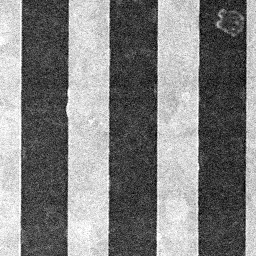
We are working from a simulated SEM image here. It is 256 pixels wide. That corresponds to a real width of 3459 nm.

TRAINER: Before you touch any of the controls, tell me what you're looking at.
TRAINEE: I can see one or a few lines or trenches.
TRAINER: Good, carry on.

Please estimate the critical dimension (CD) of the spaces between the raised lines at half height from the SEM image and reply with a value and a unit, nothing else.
0.652 microns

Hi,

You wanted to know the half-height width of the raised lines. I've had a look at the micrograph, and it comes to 0.542 microns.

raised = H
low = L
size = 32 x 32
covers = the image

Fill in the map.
HHHLLLLLLHHHHHLLLLLLHHHHHLLLLLLH
HHHLLLLLLHHHHHLLLLLLHHHHHLLLLLLH
HHHLLLLLLHHHHHLLLLLLHHHHHLLLHHLH
HHHLLLLLLHHHHHLLLLLLHHHHHLLLHHLH
HHHLLLLLLHHHHHLLLLLLHHHHHLLLLLLH
HHHLLLLLLHHHHHLLLLLLHHHHHLLLLLLH
HHHLLLLLLHHHHHLLLLLLHHHHHLLLLLLH
HHHLLLLLLHHHHHLLLLLLHHHHHLLLLLLH
HHHLLLLLLHHHHHLLLLLLHHHHHLLLLLLH
HHHLLLLLLHHHHHLLLLLLHHHHHLLLLLLH
HHHLLLLLLHHHHHLLLLLLHHHHHLLLLLLH
HHLLLLLLLHHHHHLLLLLLHHHHHLLLLLLH
HHLLLLLLLHHHHHLLLLLLHHHHHLLLLLLH
HHLLLLLLHHHHHHLLLLLLHHHHHLLLLLLH
HHLLLLLLHHHHHHLLLLLLHHHHHLLLLLLH
HHHLLLLLLHHHHHLLLLLLHHHHHLLLLLLH
HHHLLLLLLHHHHHLLLLLLHHHHHLLLLLLH
HHHLLLLLLHHHHHLLHLLLHHHHHLLLLLLH
HHHLLLLLLHHHHLLLLLLLHHHHHLLLLLLH
HHHLLLLLLHHHHLLLLLLLHHHHHLLLLLLH
HHHLLLLLLHHHHLLLLLLLHHHHHLLLLLLH
HHHLLLLLLHHHHLLLLLLLHHHHHLLLLLLH
HHHLLLLLLHHHHLLLLLLLHHHHHLLLLLLH
HHHLLLLLLHHHHLLLLLLLHHHHHLLLLLLH
HHHLLLLLLHHHHLLLLLLLHHHHHLLLLLLH
HHHLLLLLLHHHHLLLLLLLHHHHHLLLLLLH
HHLLLLLLLHHHHLLLLLLLHHHHHLLLLLLH
HHLLLLHLLHHHHLLLLLLLHHHHHLLLLLLH
HHLLLLLLLHHHHLLLLLLLHHHHHLLLLLLH
HHLLLLLLLHHHHLLLLLLLHHHHHLLLLLLH
HHLLLLLLLHHHHLLLLLLLHHHHHLLLLLLH
HHLLLLLLLHHHHLLLLLLLHHHHHLLLLLLH